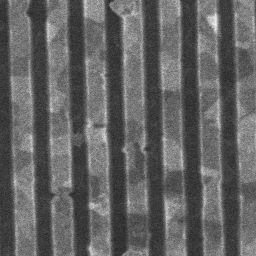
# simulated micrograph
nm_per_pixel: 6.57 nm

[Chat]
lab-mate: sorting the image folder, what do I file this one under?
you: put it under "parallel lines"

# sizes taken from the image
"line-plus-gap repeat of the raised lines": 246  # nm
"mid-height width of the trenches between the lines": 103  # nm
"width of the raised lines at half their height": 140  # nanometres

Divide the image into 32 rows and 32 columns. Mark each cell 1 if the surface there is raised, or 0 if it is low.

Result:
01110011001110111100111001100111
01100011000110111100111001100111
01110011001110011100111001100111
01110011001110011100111001100111
01110011001110011100111001100111
01110011100110011100111001100111
01110011100110011100111001100111
01110011100110011100111001100111
01110011100110011100111001100111
01110011100110011100111001100111
01110011100110011100111001100111
01110011100110011100111001100011
01110011100110011100111001100011
01110011100110011100111001110011
00110011100110011100111001110011
00110011100110001100111001110011
00110011100110001100111001110011
01110011100111001100111001110011
00110011100111011100111001110011
00110011100111001100111001110011
00110011100111001100111001110011
00110011100111001100111001110011
00110011100111001100111001110011
00110011100111001100111001110011
00110001100111001100011001110011
00110011100111001100011001110011
00110011100111001100011001110011
00110011100111001110011001110011
00110001100111001110011001110011
00110001100111001110011001110011
00111001100111001110011001110011
00111001100111001110011001110011